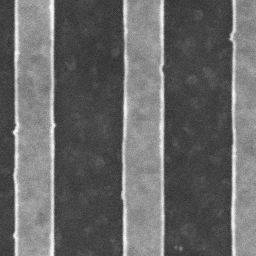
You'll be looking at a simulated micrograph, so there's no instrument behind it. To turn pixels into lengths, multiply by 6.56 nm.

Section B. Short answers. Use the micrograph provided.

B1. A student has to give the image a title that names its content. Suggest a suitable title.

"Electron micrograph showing one or a few lines or trenches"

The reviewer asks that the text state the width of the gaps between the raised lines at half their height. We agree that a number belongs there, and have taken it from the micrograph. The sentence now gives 0.465 um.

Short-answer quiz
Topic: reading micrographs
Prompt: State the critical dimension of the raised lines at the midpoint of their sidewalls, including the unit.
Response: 250 nm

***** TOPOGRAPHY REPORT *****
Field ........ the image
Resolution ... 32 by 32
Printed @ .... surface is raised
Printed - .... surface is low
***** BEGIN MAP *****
--@@@@@---------@@@@---------@@@
--@@@@@---------@@@@---------@@@
--@@@@@---------@@@@---------@@@
--@@@@@---------@@@@---------@@@
--@@@@@---------@@@@---------@@@
--@@@@@---------@@@@---------@@@
--@@@@@---------@@@@---------@@@
--@@@@@---------@@@@---------@@@
--@@@@@---------@@@@---------@@@
--@@@@@---------@@@@---------@@@
--@@@@@---------@@@@---------@@@
--@@@@@---------@@@@---------@@@
--@@@@@---------@@@@---------@@@
--@@@@@---------@@@@---------@@@
--@@@@@---------@@@@---------@@@
--@@@@@---------@@@@---------@@@
--@@@@@---------@@@@---------@@@
--@@@@@--------@@@@@---------@@@
--@@@@@--------@@@@@---------@@@
--@@@@@--------@@@@@---------@@@
--@@@@@--------@@@@@---------@@@
--@@@@@--------@@@@@---------@@@
--@@@@@--------@@@@@---------@@@
--@@@@@--------@@@@@---------@@@
--@@@@@--------@@@@@---------@@@
--@@@@@--------@@@@@---------@@@
--@@@@@--------@@@@@---------@@@
--@@@@@--------@@@@@---------@@@
--@@@@@--------@@@@@---------@@@
--@@@@@---------@@@@---------@@@
--@@@@@--------@@@@@---------@@@
--@@@@@---------@@@@---------@@@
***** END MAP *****